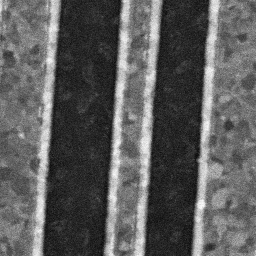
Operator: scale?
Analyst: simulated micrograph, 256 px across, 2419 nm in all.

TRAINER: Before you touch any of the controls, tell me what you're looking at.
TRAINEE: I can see one or a few lines or trenches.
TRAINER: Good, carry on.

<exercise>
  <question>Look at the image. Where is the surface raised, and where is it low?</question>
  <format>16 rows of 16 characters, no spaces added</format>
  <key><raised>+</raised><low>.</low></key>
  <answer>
+++.....++...+++
+++.....++...+++
+++.....++...+++
+++.....+....+++
+++.....+....+++
+++.....+....+++
+++....++....+++
+++....++....+++
+++....++....+++
+++....++....+++
+++....++....+++
+++....++....+++
++.....++....+++
++.....++....+++
++.....++...++++
++.....++...++++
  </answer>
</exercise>